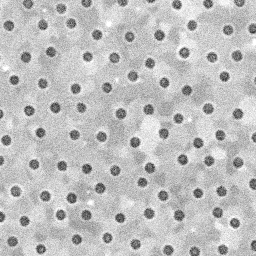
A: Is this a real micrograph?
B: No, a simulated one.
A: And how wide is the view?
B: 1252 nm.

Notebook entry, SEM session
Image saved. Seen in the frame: a regular array of holes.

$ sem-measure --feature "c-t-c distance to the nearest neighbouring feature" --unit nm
117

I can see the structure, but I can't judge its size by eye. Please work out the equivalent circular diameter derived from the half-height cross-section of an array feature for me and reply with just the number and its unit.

56.5 nanometers